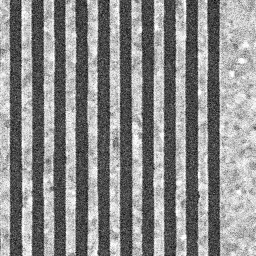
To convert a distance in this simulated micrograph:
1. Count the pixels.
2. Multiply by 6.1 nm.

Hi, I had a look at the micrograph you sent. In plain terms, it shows parallel lines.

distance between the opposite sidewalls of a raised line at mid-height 0.0549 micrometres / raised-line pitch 21.9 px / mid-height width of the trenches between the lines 82.4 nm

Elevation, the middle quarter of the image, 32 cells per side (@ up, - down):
-@@---@@----@@---@@----@@---@@--
-@@---@@----@@---@@----@@---@@--
-@@---@@----@@---@@----@@---@@--
-@@---@@----@@---@@----@@---@@--
-@@---@@----@@---@@----@@---@@--
-@@---@@----@@---@@----@@---@@--
-@@---@@----@@---@@----@@---@@--
-@@---@@----@@---@@----@@---@@--
-@@---@@----@@---@@----@@---@@--
-@@---@@----@@---@@----@@---@@--
-@@---@@----@@---@@----@@---@@--
-@@---@@----@@---@@----@@---@@--
-@@---@@----@@---@@----@@---@@--
-@@---@@----@@---@@----@@---@@--
-@@---@@----@@---@@----@@---@@--
-@@---@@----@@---@@----@@---@@--
-@@---@@----@@---@@----@@---@@--
-@@---@@----@@---@@----@@---@@--
-@@---@@----@@---@@----@@---@@--
-@@---@@----@@---@@----@@---@@--
-@@---@@----@@---@@----@@---@@--
-@@---@@----@@---@@----@@---@@--
-@@---@@----@@---@@----@@---@@--
-@@---@@----@@---@@----@@---@@--
-@@---@@----@@---@@----@@---@@--
-@@---@@----@@---@@----@@---@@--
-@@---@@----@@---@@----@@---@@--
-@@---@@----@@---@@----@@---@@--
-@@---@@----@@---@@----@@---@@--
-@@---@@----@@---@@----@@---@@--
-@@---@@----@@---@@----@@---@@--
-@@---@@----@@---@@----@@---@@--